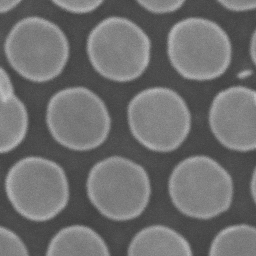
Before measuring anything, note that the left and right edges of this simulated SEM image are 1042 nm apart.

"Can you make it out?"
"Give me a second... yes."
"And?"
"a regular array of raised bodies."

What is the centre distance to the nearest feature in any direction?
326 nm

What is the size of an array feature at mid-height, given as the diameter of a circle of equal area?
0.251 um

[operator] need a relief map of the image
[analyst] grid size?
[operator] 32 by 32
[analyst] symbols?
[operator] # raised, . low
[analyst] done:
##.....#####......#####.....####
...................##...........
...##........###.......##.......
..#####.....#####.....#####.....
.#######...#######...#######....
.#######...########..########..#
.#######...########..########..#
.#######...#######...########...
..######....######....######....
#..####......####......####...#.
#...............................
##.....####.......####......####
##....#######....######....#####
###...#######...#######....#####
###...########..########..######
###...########..########..######
###....######....######....#####
###....######....######.....####
#........##........###.......###
................................
..#####.....#####......####.....
.#######...#######....######....
.#######...#######...########...
.#######...########..########...
.#######...########..########...
..######....######....#######...
..#####......#####.....#####....
................................
.........##.......###........###
##.....#####.....######....#####
###...#######...#######....#####
###...########..########..######